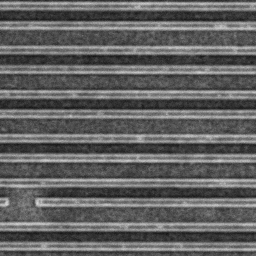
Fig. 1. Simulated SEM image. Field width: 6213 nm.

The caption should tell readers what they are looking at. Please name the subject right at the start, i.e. parallel lines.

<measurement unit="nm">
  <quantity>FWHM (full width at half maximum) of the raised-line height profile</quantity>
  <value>155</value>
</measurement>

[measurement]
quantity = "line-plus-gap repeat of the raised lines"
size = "530 nm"